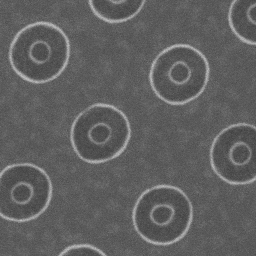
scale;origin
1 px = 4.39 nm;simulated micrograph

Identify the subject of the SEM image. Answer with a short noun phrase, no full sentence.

ring-shaped raised bodies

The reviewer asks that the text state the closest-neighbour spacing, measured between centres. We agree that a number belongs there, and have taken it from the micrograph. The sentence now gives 438 nm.